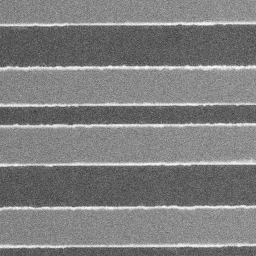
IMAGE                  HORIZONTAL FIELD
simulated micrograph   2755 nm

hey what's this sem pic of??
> lines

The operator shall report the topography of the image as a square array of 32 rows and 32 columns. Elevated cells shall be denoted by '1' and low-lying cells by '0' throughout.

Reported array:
11111111111111111111111111111111
11111111111111111111111111111111
11111111111111111111111111111111
00000000000000000000000000000000
00000000000000000000000000000000
00000000000000000000000000000000
00000000000000000000000000000000
00000000000000000000000000000000
01001001011111111111111111111111
11111111111111111111111111111111
11111111111111111111111111111111
11111111111111111111111111111111
11111111111111111111111111111111
00000000000000000000000000000000
00000000000000000000000000000000
00000000000000000000000000000000
11111111111111111111111111111111
11111111111111111111111111111111
11111111111111111111111111111111
11111111111111111111111111111111
11111111111111111111110000000000
00000000000000000000000000000000
00000000000000000000000000000000
00000000000000000000000000000000
00000000000000000000000000000000
00000000000000000000000000000000
11111111111111111111111111111111
11111111111111111111111111111111
11111111111111111111111111111111
11111111111111111111111111111111
11111111111111111111111111111111
00000000000000000000000000000000